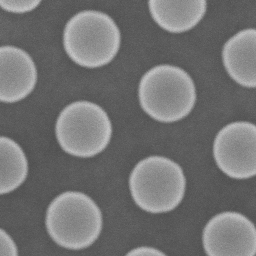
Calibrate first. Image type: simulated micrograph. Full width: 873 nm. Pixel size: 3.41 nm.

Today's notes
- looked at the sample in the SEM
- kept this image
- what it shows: raised bodies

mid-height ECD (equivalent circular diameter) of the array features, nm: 187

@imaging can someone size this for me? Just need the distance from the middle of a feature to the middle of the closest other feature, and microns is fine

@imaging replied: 0.31